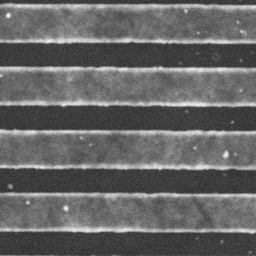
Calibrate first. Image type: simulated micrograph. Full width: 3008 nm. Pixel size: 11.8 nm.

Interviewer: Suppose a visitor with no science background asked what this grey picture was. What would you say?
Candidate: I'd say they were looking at lines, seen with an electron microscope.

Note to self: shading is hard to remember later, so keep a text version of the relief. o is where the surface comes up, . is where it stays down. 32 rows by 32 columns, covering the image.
................................
oooooooooooooooooooooooooooooooo
oooooooooooooooooooooooooooooooo
oooooooooooooooooooooooooooooooo
oooooooooooooooooooooooooooooooo
................................
................................
................................
................................
oooooooooooooooooooooooooooooooo
oooooooooooooooooooooooooooooooo
oooooooooooooooooooooooooooooooo
oooooooooooooooooooooooooooooooo
................................
................................
................................
oooooooooooooooooooooooooooooooo
oooooooooooooooooooooooooooooooo
oooooooooooooooooooooooooooooooo
oooooooooooooooooooooooooooooooo
oooooooooooooooooooooooooooooooo
................................
................................
................................
oooooooooooooooooooooooooooooooo
oooooooooooooooooooooooooooooooo
oooooooooooooooooooooooooooooooo
oooooooooooooooooooooooooooooooo
oooooooooooooooooooooooooooooooo
................................
................................
................................